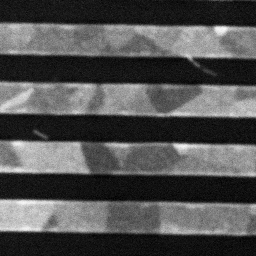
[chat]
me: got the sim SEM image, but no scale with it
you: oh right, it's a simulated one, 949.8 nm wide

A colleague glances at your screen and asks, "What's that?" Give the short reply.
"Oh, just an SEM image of wiring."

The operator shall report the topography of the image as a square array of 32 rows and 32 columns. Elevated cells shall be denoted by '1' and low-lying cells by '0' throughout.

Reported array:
00000000000000000000000000000000
00000000000000000000000000000000
00000000000000000000000000000000
11111111111111111111111111110000
11111111111111111111111111111111
11111111111111111111111111111111
11111111111111111111111111111111
00000000000000000000000000000000
00000000000000000000000000000000
00000000000000000000000000000000
11110000000000000000000000000000
11111111111111111111111111111111
11111111111111111111111111111111
11111111111111111111111111111111
00000000000000000000000000000111
00000000000000000000000000000000
00000000000000000000000000000000
00000000000000000000000000000000
11111111111111111111111111111111
11111111111111111111111111111111
11111111111111111111111111111111
00001111111111111111111111111111
00000000000000000000000000000000
00000000000000000000000000000000
00000000000000000000000000000000
11111111111111111111111111110000
11111111111111111111111111111111
11111111111111111111111111111111
11111111111111111111111111111111
00000000000000000000000000000000
00000000000000000000000000000000
00000000000000000000000000000000